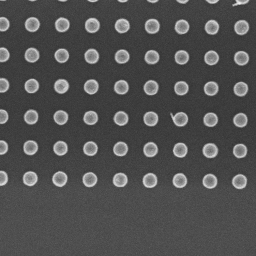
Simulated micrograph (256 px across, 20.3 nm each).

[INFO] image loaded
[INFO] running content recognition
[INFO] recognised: a regular array of raised bodies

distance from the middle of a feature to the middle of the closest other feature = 605 nm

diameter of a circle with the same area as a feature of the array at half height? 286 nm